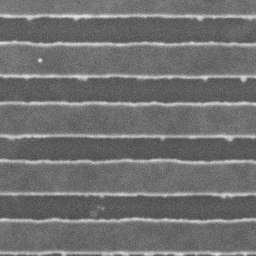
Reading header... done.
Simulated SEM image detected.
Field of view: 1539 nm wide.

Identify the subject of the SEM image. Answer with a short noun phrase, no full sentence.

lines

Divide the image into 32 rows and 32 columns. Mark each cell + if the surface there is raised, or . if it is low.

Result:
++++++++++++++++++++++++++++++++
++++++++++++++++++++++++++++++++
................................
................................
................................
+++++.++++++++..++++++++++++++..
++++++++++++++++++++++++++++++++
++++++++++++++++++++++++++++++++
++++++++++++++++++++++++++++++++
++++++++++++++.+++++++++++++++++
................................
................................
................................
++++++++++++++++++++++++++++++++
++++++++++++++++++++++++++++++++
++++++++++++++++++++++++++++++++
++++++++++++++++++++++++++++++++
................................
................................
................................
++++++++++++++++++++++++++++++++
++++++++++++++++++++++++++++++++
++++++++++++++++++++++++++++++++
++++++++++++++++++++++++++++++++
................................
................................
................................
++++.++++.++++++++++++++..++.+++
++++++++++++++++++++++++++++++++
++++++++++++++++++++++++++++++++
++++++++++++++++++++++++++++++++
++++++++++++++++++++++++++++++++